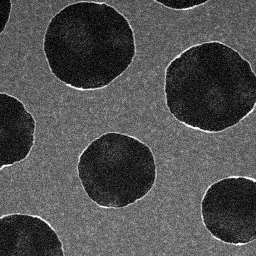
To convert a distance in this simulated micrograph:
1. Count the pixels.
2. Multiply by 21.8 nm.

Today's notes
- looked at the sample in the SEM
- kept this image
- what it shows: holes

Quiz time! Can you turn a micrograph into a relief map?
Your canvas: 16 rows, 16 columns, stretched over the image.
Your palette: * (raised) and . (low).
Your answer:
.***...****.****
***.....********
***.....********
***.....***....*
***.....**......
*****.****......
.*********......
..*********....*
..****..********
..***....*******
*****.....******
*****.....***...
******...****...
..***********...
...**********...
....************